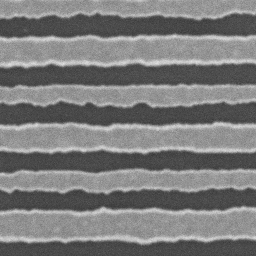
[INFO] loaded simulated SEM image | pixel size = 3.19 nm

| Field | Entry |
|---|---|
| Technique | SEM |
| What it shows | lines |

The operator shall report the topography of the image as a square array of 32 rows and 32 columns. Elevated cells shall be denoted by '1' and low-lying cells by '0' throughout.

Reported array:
11111111111111111111111111111111
11111111111111111111111111111111
00000000000000000000000000000000
00000000000000000000000000000000
00000000000100000101011101100000
11111111111111111111111111111111
11111111111111111111111111111111
11111111111111111111111111111111
00000000000000000000000000000000
00000000000000000000000000000000
00000000000000000000000000000000
11111111111111111111111111111111
11111111111111111111111111111111
00000000000000000000000000000000
00000000000000000000000000000000
00000000110000000000000000011000
11111111111111111111111111111111
11111111111111111111111111111111
11111111111111111111111111111111
00000000000000000000000000000000
00000000000000000000000000000000
00110111110000111111111111111111
11111111111111111111111111111111
11111111111111111111111111010110
00000000000000000000000000000000
00000000000000000000000000000000
11111111111111111111111111111111
11111111111111111111111111111111
11111111111111111111111111111111
11111111111111111111111111111111
00000000000000000000000000000000
00000000000000000000000000000000